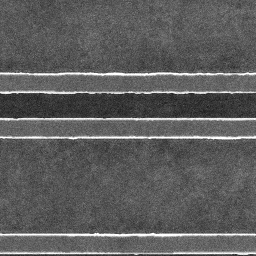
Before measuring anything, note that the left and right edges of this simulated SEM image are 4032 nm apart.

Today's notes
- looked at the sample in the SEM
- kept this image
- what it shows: lines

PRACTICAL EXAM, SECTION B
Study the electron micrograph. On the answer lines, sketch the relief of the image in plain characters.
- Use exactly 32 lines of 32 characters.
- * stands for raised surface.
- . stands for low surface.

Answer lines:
................................
................................
................................
................................
................................
................................
................................
................................
................................
********************************
********************************
********************************
................................
................................
................................
********************************
********************************
................................
................................
................................
................................
................................
................................
................................
................................
................................
................................
................................
................................
********************************
********************************
********************************